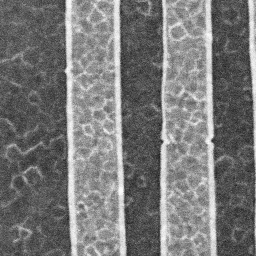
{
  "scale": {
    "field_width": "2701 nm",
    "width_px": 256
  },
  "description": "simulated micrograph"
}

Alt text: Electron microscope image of one or a few lines or trenches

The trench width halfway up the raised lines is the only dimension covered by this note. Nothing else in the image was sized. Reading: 476 nm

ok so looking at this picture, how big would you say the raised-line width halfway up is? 48.1 px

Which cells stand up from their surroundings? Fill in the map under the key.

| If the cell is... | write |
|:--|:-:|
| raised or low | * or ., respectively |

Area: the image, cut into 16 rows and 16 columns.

....***...***...
....***...***...
....***...***...
....***...***...
....***...***...
....***...***...
....***...***...
....***...***...
....***...***...
....***...***...
....***...***...
....****..***...
....****..***...
.....***..***...
.....***..***...
.....***..***...